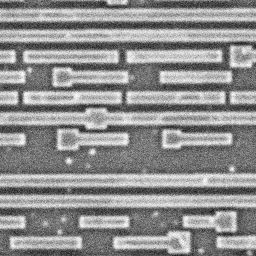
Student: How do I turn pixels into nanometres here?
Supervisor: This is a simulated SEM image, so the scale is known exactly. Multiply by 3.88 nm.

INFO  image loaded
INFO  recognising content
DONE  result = wiring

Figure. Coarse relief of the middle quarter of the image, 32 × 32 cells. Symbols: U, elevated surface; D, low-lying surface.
DDDDDDDDDDDDDDDDDDDDDDDDDDDDDDDD
UUDDDDDDDDDDDDDDDDDDDDDDDDDDDDDD
UUUUUUUUUUUUUUUUDDDDDDDDUUUUUUUU
UUUUUUUUUUUUUUUUDDDDDDDDUUUUUUUU
UUDDDDDDDDDDDDDDDDDDDDDDDDDDDDDD
DDDDDDDDDDDDDDDDDDDDDDDDDDDDDDDD
DDDDDDDDDDDDDDDDDDDDDDDDDDDDDDDD
UUUUUUUUUUUUUUDDUUUUUUUUUUUUUUUU
UUUUUUUUUUUUUUDDUUUUUUUUUUUUUUUU
UUUUUUUUUUUUUUDDUUUUUUUUUUUUUUUU
DDDDDDDDDDDDDDDDDDDDDDDDDDDDDDDD
DDDDDDUUUUDDDDDDDDDDDDDDDDDDDDDD
UUUUUUUUUUUUUUUUUUUUUUUUUUUUUUUU
UUUUUUUUUUUUUUUUUUUUUUUUUUUUUUUU
UUUUUUUUUUUUUUUUUUUUUUUUUUUUUUUU
DDDDDDUUUUDDDDDDDDDDDDDDDDDDDDDD
UUUDDDDDDDDDDDDDDDDDDDDDDDDDDDDD
UUUUDDDDDDDDDDDDDDDDDDDDDUUUUDDD
UUUUUUUUUUUUUUUUDDDDDDDDDUUUUUUU
UUUUUUUUUUUUUUUUDDDDDDDDDUUUUUUU
UUUDDDDDDDDDDDDDDDDDDDDDDUUUUDDD
DDDDDDDDDDDDDDDDDDDDDDDDDDDDDDDD
DDDDDDDDDDDDDDDDDDDDDDDDDDDDDDDD
DDDDDDDDDDDDDDDDDDDDDDDDDDDDDDDD
DDDDDDDDDDDDDDDDDDDDDDDDDDDDDDDD
DDDDDDDDDDDDDDDDDDDDDDDDDDDDDDDD
DDDDDDDDDDDDDDDDDDDDDDDDDDDDDDDD
DDDDDDDDDDDDDDDDDDDDDDDDDDDDDDDD
UUUUUUUUUUUUUUUUUUUUUUUUUUUUUUUU
UUUUUUUUUUUUUUUUUUUUUUUUUUUUUUUU
DDDDDDDDDDDDDDDDDDDDDDDDDDDDDDDD
DDDDDDDDDDDDDDDDDDDDDDDDDDDDDDDD